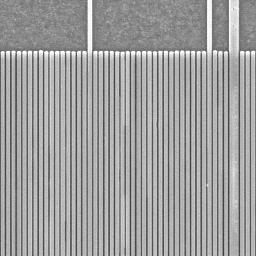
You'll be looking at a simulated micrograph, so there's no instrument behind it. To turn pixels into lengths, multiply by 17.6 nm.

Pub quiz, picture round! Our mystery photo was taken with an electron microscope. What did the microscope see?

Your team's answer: parallel lines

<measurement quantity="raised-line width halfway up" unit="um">0.0616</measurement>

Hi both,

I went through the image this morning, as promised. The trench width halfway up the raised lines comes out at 30.8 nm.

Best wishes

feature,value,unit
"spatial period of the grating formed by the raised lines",95.7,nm